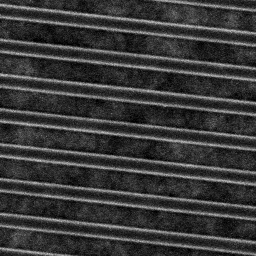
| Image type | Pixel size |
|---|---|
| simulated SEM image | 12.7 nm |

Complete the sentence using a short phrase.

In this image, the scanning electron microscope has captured parallel lines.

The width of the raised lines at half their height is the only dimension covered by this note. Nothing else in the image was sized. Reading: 166 nm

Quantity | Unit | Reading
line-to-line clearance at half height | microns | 0.275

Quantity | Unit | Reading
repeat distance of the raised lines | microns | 0.44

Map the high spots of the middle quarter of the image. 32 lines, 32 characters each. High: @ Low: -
---------------@@@@@@@@@@@@@@@@@
------------------------@@@@@@@@
--------------------------------
--------------------------------
@-------------------------------
@@@@@@@@@-----------------------
@@@@@@@@@@@@@@@@@@--------------
@@@@@@@@@@@@@@@@@@@@@@@@@@@-----
--------@@@@@@@@@@@@@@@@@@@@@@@@
-----------------@@@@@@@@@@@@@@@
----------------------------@@@@
--------------------------------
--------------------------------
@@@-----------------------------
@@@@@@@@@@@@--------------------
@@@@@@@@@@@@@@@@@@@@@-----------
----@@@@@@@@@@@@@@@@@@@@@@@@@@--
-------------@@@@@@@@@@@@@@@@@@@
----------------------@@@@@@@@@@
-------------------------------@
--------------------------------
--------------------------------
@@@@@-@@------------------------
@@@@@@@@@@@@@@@@----------------
@@@@@@@@@@@@@@@@@@@@@@@---------
------@@@@@@@@@@@@@@@@@@@@@@@@@@
---------------@@@@@@@@@@@@@@@@@
------------------------@@@@@@@@
--------------------------------
--------------------------------
@-------------------------------
@@@@@@@@@@----------------------